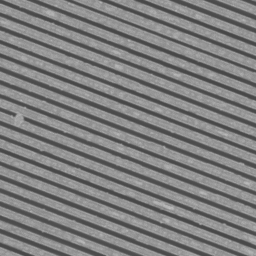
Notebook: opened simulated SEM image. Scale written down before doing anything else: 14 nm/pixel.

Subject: parallel lines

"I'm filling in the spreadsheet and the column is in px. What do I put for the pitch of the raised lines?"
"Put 12.6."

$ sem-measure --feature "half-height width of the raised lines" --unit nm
125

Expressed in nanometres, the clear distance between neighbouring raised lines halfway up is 50.8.